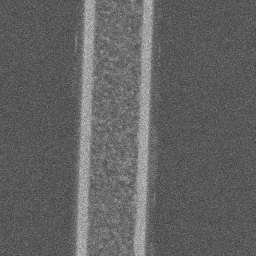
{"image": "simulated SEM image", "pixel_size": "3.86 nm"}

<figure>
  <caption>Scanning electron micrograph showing one or a few lines or trenches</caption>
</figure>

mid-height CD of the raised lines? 224 nm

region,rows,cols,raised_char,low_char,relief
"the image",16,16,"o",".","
......ooo.......
......ooo.......
......ooo.......
......ooo.......
......ooo.......
.....oooo.......
.....oooo.......
.....oooo.......
.....oooo.......
.....oooo.......
.....oooo.......
.....oooo.......
.....oooo.......
.....oooo.......
.....oooo.......
.....oooo.......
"